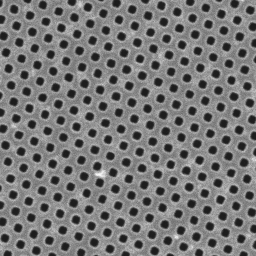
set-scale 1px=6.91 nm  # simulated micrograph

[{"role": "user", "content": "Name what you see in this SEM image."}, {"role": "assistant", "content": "a regular array of holes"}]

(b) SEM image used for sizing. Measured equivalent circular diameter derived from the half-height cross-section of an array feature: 58.9 nanometres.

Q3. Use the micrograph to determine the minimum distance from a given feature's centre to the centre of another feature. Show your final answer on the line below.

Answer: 0.114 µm